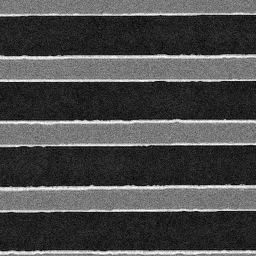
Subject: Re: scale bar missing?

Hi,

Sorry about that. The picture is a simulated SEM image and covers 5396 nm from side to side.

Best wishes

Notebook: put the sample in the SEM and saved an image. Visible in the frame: lines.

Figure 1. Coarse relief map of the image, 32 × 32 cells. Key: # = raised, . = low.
################################
################################
................................
................................
................................
................................
................................
################################
################################
################################
................................
................................
................................
................................
................................
################################
################################
################################
................................
................................
................................
................................
................................
...#############################
################################
################################
................................
................................
................................
................................
................................
################################